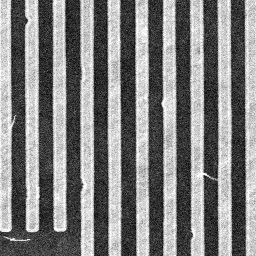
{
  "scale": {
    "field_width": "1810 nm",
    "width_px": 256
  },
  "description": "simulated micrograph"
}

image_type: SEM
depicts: parallel lines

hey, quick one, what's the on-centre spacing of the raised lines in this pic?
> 194 nm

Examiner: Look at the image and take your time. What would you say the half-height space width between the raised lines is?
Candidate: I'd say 120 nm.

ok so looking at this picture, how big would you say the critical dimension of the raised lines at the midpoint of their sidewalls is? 0.076 um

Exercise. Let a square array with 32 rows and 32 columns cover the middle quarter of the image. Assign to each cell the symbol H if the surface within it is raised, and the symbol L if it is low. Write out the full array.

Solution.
LLLLLHHLLLLHHHLLLLHHHLLLLHHHLLLL
LLLLLHHLLLLHHHLLLLHHHLLLLHHHLLLL
LLLLLHHLLLLHHHLLLLHHHLLLLHHHLLLL
LLLLLHHLLLLHHHLLLLHHHLLLLHHHLLLL
LLLLLHHLLLLHHHLLLLHHHLLLLHHHLLLL
LLLLLHHLLLLHHHLLLLHHHLLLLHHHLLLL
LLLLLHHLLLLHHHLLLLHHHLLLLHHHLLLL
LLLLLHHLLLLHHHLLLLHHHLLLLHHHLLLL
LLLLLHHLLLLHHHLLLLHHHLLLLHHHLLLL
LLLLLHHLLLLHHHLLLLHHHLLLLHHHLLLL
LLLLLHHLLLLHHHLLLLHHHLLLLHHHLLLL
LLLLLHHLLLLHHHLLLLHHHLLLLHHHLLLL
LLLLLHHLLLLHHHLLLLHHHLLLLHHHLLLL
LLLLLHHLLLLHHHLLLLHHHLLLLHHHLLLL
LLLLLHHLLLLHHHLLLLHHHLLLLHHHLLLL
LLLLHHHLLLLHHHLLLLHHHLLLLHHHLLLL
LLLLHHHLLLLHHHLLLLHHHLLLLHHHLLLL
LLLLHHHLLLLHHHLLLLHHHLLLLHHHLLLL
LLLLHHHLLLLHHHLLLLHHHLLLLHHHLLLL
LLLLHHHLLLLHHHLLLLHHHLLLLHHHLLLL
LLLLHHHLLLLHHHLLLLHHHLLLLHHHLLLL
LLLLHHHLLLLHHHLLLLHHHLLLLHHHLLLL
LLLLHHHLLLLHHHLLLLHHHLLLLHHHLLLL
LLLLHHHLLLLHHHLLLLHHHLLLLHHHLLLL
LLLLHHHLLLLHHHLLLLHHHLLLLHHHLLLL
LLLLHHHLLLLLHHLLLLHHHLLLLHHHLLLL
LLLLHHHLLLLLHHLLLLHHHLLLLHHHLLLL
LLLLHHHLLLLLHHLLLLHHHLLLLHHHLLLL
LLLLHHHLLLLLHHLLLLHHHLLLLHHHLLLL
LLLLLHHLLLLLHHLLLLHHHLLLLHHHLLLL
LLLLLHHLLLLLHHLLLLHHHLLLLHHHLLLL
LLLLLHHLLLLLHHLLLLHHHLLLLHHHLLLL